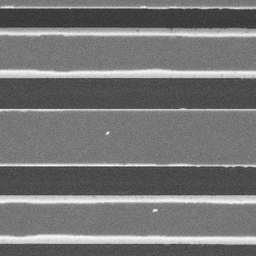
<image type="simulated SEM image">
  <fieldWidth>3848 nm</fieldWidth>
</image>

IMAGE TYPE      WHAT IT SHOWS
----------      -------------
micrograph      lines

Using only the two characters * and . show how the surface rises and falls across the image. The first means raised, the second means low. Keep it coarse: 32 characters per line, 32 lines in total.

********************************
................................
................................
................................
********************************
********************************
********************************
********************************
********************************
................................
................................
................................
................................
................................
********************************
********************************
********************************
********************************
********************************
********************************
********************************
................................
................................
................................
................................
********************************
********************************
********************************
********************************
********************************
................................
................................